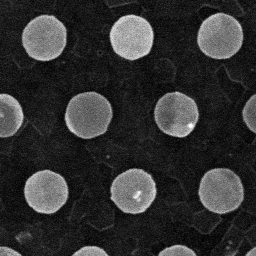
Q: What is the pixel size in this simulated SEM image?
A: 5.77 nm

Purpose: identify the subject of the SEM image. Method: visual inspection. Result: a regular array of raised bodies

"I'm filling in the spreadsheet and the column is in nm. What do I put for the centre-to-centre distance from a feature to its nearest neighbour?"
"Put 504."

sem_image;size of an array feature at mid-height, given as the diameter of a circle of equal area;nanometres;256